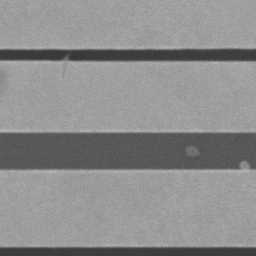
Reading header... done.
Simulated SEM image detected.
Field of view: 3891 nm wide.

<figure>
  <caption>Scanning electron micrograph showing lines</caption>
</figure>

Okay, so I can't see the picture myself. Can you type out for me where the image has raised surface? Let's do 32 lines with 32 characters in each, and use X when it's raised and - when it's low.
XXXXXXXXXXXXXXXXXXXXXXXXXXXXXXXX
XXXXXXXXXXXXXXXXXXXXXXXXXXXXXXXX
XXXXXXXXXXXXXXXXXXXXXXXXXXXXXXXX
XXXXXXXXXXXXXXXXXXXXXXXXXXXXXXXX
XXXXXXXXXXXXXXXXXXXXXXXXXXXXXXXX
XXXXXXXXXXXXXXXXXXXXXXXXXXXXXXXX
--------------------------------
--------X-----------------------
XXXXXXXXXXXXXXXXXXXXXXXXXXXXXXXX
XXXXXXXXXXXXXXXXXXXXXXXXXXXXXXXX
XXXXXXXXXXXXXXXXXXXXXXXXXXXXXXXX
XXXXXXXXXXXXXXXXXXXXXXXXXXXXXXXX
XXXXXXXXXXXXXXXXXXXXXXXXXXXXXXXX
XXXXXXXXXXXXXXXXXXXXXXXXXXXXXXXX
XXXXXXXXXXXXXXXXXXXXXXXXXXXXXXXX
XXXXXXXXXXXXXXXXXXXXXXXXXXXXXXXX
--------------------------------
--------------------------------
--------------------------------
--------------------------------
--------------------------------
XXXXXXXXXXXXXXXXXXXXXXXXXXXXXXXX
XXXXXXXXXXXXXXXXXXXXXXXXXXXXXXXX
XXXXXXXXXXXXXXXXXXXXXXXXXXXXXXXX
XXXXXXXXXXXXXXXXXXXXXXXXXXXXXXXX
XXXXXXXXXXXXXXXXXXXXXXXXXXXXXXXX
XXXXXXXXXXXXXXXXXXXXXXXXXXXXXXXX
XXXXXXXXXXXXXXXXXXXXXXXXXXXXXXXX
XXXXXXXXXXXXXXXXXXXXXXXXXXXXXXXX
XXXXXXXXXXXXXXXXXXXXXXXXXXXXXXXX
XXXXXXXXXXXXXXXXXXXXXXXXXXXXXXXX
--------------------------------